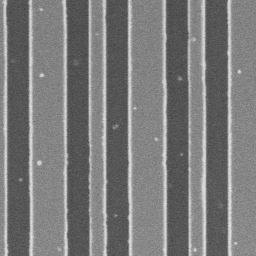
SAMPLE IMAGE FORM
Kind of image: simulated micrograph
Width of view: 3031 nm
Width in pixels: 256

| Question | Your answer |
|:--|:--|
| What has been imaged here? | lines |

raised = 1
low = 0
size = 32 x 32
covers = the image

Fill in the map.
10001111000110001111100011000111
10001111000110001111100011000111
10001111000110001111100011000111
10001111000110001111100011000111
10001111000110001111100011000111
10001111000110001111100011000111
10001111000110001111100011000111
10001111000110001111100011000111
10001111000110001111100011000111
10001111000110001111100011000111
10001111000110001111100011000111
10001111000110001111100011000111
10001111000110001111100011000111
10001111000110001111100011000111
10001111000110001111100011000111
10001111000110001111100011000111
10001111000110001111100011000111
10001111000110001111100011000111
10001111000110001111100011000111
10001111000110001111100011000111
10001111000110001111100011000111
10001111000110001111100011000111
10001111000110001111100011000111
10001111000110001111100011000111
10001111000110001111100011000111
10001111000110001111100011000111
10001111000110001111100011000111
10001111000110001111100011000111
10001111000110001111100011000111
10001111000110001111100011000111
10001111000110001111100011000111
10001111000110001111100011000111